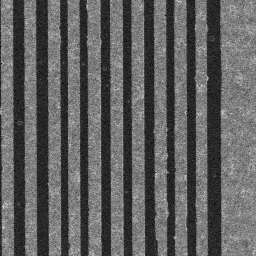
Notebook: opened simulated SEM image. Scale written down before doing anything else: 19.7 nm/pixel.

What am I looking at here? parallel lines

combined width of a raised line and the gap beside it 424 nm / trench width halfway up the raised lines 192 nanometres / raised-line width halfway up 12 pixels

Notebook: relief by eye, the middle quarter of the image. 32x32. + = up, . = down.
.+++..+++...++...+++...++...+++.
.+++..+++...++...+++...++...+++.
.+++..+++...++...+++...++...+++.
.+++..+++...++...+++...++...+++.
.+++..+++...+++..+++...++...++..
.+++..+++...+++..+++...++...++..
.+++..+++...+++..+++...++...+++.
.+++..+++...+++..+++...++...+++.
.+++..+++...+++..+++...++...+++.
.+++..+++...+++..+++...++...+++.
.+++..+++...+++..+++...++...++..
.+++..+++...+++..+++...++...+++.
.+++..+++...+++..+++...++...++..
.+++..+++...+++..+++...++...+++.
.+++..+++...+++..+++...++...+++.
.+++..+++...+++..+++...+++..+++.
.+++..+++...+++..+++...+++..+++.
.+++..+++...+++..+++...+++..+++.
.+++..+++...+++..+++...+++..+++.
.+++..+++...+++..+++...+++..+++.
.+++..+++...+++..+++...+++..+++.
.+++..+++...+++..+++...+++..+++.
.+++..+++...+++..+++...+++..+++.
.+++..+++...+++..+++...+++..+++.
.+++..+++...+++..+++...+++..+++.
.+++..+++...+++..+++...+++..+++.
.+++..+++...+++..+++...+++..+++.
.+++..+++...+++..+++...+++..+++.
.+++..+++...+++..+++...+++..+++.
.+++..+++...+++..+++...+++..+++.
.+++..+++...+++..+++...+++..+++.
.+++..+++...+++..+++...+++..+++.